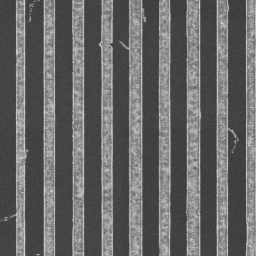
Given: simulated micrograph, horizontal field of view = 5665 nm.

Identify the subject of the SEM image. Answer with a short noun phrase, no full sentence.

parallel lines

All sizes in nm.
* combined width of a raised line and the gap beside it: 636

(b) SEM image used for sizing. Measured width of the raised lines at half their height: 230 nm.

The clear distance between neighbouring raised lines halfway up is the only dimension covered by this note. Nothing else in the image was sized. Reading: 0.401 microns